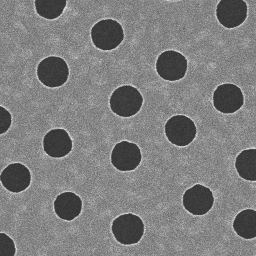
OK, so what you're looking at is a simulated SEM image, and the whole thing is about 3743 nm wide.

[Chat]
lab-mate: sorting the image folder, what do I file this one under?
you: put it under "a regular array of holes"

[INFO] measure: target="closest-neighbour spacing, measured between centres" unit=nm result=928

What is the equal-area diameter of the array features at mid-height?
457 nanometres